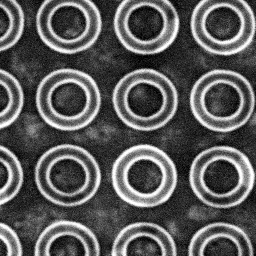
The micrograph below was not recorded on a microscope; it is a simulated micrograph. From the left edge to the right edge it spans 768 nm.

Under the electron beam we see ring-shaped raised bodies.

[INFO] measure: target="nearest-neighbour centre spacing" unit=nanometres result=228